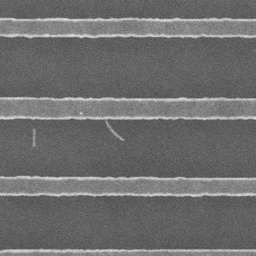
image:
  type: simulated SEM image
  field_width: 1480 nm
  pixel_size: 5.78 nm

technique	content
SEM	lines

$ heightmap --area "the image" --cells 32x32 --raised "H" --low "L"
LLLLLLLLLLLLLLLLLLLLLLLLLLLLLLLL
LLLLLLLLLLLLLLLLLLLLLLLLLLLLLLLL
HHHHHHHHHHHHHHHHHHHHHHHHHHHHHHHH
HHHHHHHHHHHHHHHHHHHHHHHHHHHHHHHH
LHLHHHHHHHHHHHHHHHHHHHHHHHHHHHHH
LLLLLLLLLLLLLLLLLLLLLLLLLLLLLLLL
LLLLLLLLLLLLLLLLLLLLLLLLLLLLLLLL
LLLLLLLLLLLLLLLLLLLLLLLLLLLLLLLL
LLLLLLLLLLLLLLLLLLLLLLLLLLLLLLLL
LLLLLLLLLLLLLLLLLLLLLLLLLLLLLLLL
LLLLLLLLLLLLLLLLLLLLLLLLLLLLLLLL
LLLLLLLLLLLLLLLLLLLLLLLLLLLLLLLL
HHHHHHHHHHHHHHHHHHHHHHHHHHHHHHHH
HHHHHHHHHHHHHHHHHHHHHHHHHHHHHHHH
HHHHHHHHHHHHHHHHHHHHHHHHHHHHHHHH
LLLLLLLLLLLLLLLLLLLLLLLLLLLLLLLL
LLLLLLLLLLLLLLLLLLLLLLLLLLLLLLLL
LLLLLLLLLLLLLLLLLLLLLLLLLLLLLLLL
LLLLLLLLLLLLLLLLLLLLLLLLLLLLLLLL
LLLLLLLLLLLLLLLLLLLLLLLLLLLLLLLL
LLLLLLLLLLLLLLLLLLLLLLLLLLLLLLLL
LLLLLLLLLLLLLLLLLLLLLLLLLLLLLLLL
HHHHHHHHHHHHHHHHHHHHHHHHHHHHHHHH
HHHHHHHHHHHHHHHHHHHHHHHHHHHHHHHH
LLLLLLLLLLLLLLLLLLLLLLLLHLLLLLLL
LLLLLLLLLLLLLLLLLLLLLLLLLLLLLLLL
LLLLLLLLLLLLLLLLLLLLLLLLLLLLLLLL
LLLLLLLLLLLLLLLLLLLLLLLLLLLLLLLL
LLLLLLLLLLLLLLLLLLLLLLLLLLLLLLLL
LLLLLLLLLLLLLLLLLLLLLLLLLLLLLLLL
LLLLLLLLLLLLLLLLLLLLLLLLLLLLLLLL
HHHHHHHHHHHHHHHHHHHHHHHHHHHHHHHH